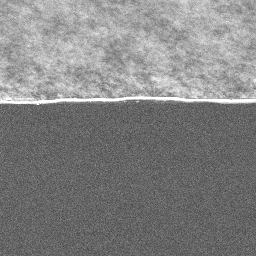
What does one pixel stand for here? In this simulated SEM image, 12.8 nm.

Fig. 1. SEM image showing one or a few lines or trenches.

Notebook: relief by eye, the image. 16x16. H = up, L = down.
LLLLLLLLLLLLLLLL
LLLLLLLLLLLLLLLL
LLLLLLLLLLLLLLLL
LLLLLLLLLLLLLLLL
LLLLLLLLLLLLLLLL
LLLLLLLLLLLLLLLL
HHHHHHHHHHHHHHHH
HHHHHHHHHHHHHHHH
HHHHHHHHHHHHHHHH
HHHHHHHHHHHHHHHH
HHHHHHHHHHHHHHHH
HHHHHHHHHHHHHHHH
HHHHHHHHHHHHHHHH
HHHHHHHHHHHHHHHH
HHHHHHHHHHHHHHHH
HHHHHHHHHHHHHHHH